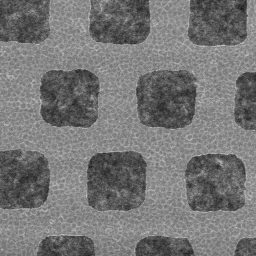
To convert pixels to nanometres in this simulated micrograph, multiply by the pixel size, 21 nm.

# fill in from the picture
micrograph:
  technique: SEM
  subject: holes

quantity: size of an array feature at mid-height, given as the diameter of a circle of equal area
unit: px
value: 64.2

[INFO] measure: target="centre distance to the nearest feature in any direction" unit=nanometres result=2000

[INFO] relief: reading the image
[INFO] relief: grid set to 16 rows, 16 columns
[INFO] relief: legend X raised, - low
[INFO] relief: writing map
---XXX---XXX---X
---XXX---XXX---X
---XXX---XXX---X
XXXXXXXXXXXXXXXX
XXX---XXX---XXXX
XX----XXX---XXX-
XXX---XXX---XXX-
XXX---XXX---XXX-
XXXXXXXXXXXXXXXX
--XXXXX-XXXXXXXX
---XX----XXX---X
---XX----XXX---X
---XX----XXX---X
XXXXXXXXXXXXXXXX
XXXXXXXXXXXXXXXX
XX----XX----XXX-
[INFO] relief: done